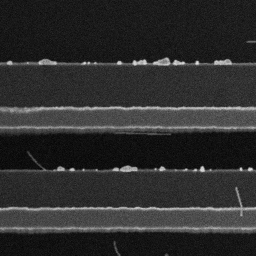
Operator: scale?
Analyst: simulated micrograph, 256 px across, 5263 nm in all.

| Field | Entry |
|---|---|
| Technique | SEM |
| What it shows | lines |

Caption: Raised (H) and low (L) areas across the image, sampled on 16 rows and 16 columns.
LLLLLLLLLLLLLLLL
LLLLLLLLLLLLLLLL
LLLLLLLLLLLLLLLL
LLLLLLLLLLLLLLLL
HHHHHHHHHHHHHHHH
HHHHHHHHHHHHHHHH
HHHHHHHHHHHHHHHH
HHHHHHHHHHHHHHHH
LLLLLLLLLLLLLLLL
LLLLLLLLLLLLLLLL
LLLLLLLHLLLLLLLL
HHHHHHHHHHHHHHHH
HHHHHHHHHHHHHHHH
HHHHHHHHHHHHHHHH
LLLLLLLLLLLLLLLL
LLLLLLLLLLLLLLLL